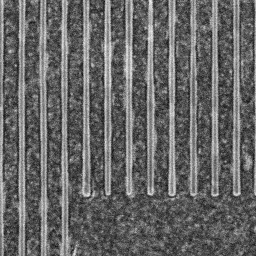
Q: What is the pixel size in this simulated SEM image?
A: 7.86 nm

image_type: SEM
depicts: parallel lines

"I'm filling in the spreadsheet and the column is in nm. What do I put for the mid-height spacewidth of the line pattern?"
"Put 138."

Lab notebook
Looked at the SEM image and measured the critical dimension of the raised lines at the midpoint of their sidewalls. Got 36.3 nm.